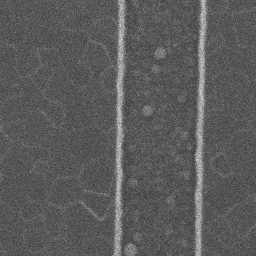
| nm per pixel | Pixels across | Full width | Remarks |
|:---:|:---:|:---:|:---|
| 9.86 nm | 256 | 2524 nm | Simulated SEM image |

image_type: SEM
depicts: one or a few lines or trenches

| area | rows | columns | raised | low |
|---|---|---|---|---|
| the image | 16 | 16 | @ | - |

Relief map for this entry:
@@@@@@@@-----@@@
@@@@@@@@-----@@@
@@@@@@@@-----@@@
@@@@@@@@-----@@@
@@@@@@@@-----@@@
@@@@@@@@-----@@@
@@@@@@@------@@@
@@@@@@@-----@@@@
@@@@@@@-----@@@@
@@@@@@@-----@@@@
@@@@@@@-----@@@@
@@@@@@@-----@@@@
@@@@@@@-----@@@@
@@@@@@@-----@@@@
@@@@@@@-----@@@@
@@@@@@@-----@@@@